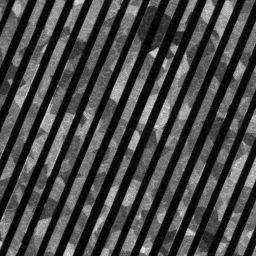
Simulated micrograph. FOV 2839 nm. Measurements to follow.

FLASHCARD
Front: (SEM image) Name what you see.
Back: parallel lines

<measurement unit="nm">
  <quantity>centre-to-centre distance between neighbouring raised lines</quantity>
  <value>194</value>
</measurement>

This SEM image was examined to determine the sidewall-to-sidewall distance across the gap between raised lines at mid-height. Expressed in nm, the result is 92.1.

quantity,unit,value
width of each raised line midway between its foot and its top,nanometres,98.6